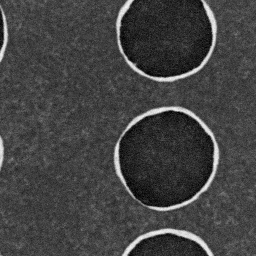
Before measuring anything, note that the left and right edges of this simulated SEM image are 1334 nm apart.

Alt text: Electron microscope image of holes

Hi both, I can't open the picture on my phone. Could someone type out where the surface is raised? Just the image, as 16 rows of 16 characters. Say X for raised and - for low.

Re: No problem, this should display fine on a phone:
XXXXXXXX-----XXX
XXXXXXX------XXX
XXXXXXX------XXX
XXXXXXXX-----XXX
XXXXXXXXX---XXXX
XXXXXXXXXXXXXXXX
XXXXXXXXXXXXXXXX
XXXXXXXXX---XXXX
XXXXXXXX-----XXX
XXXXXXX------XXX
XXXXXXX------XXX
XXXXXXXX-----XXX
XXXXXXXXX---XXXX
XXXXXXXXXXXXXXXX
XXXXXXXXXX-XXXXX
XXXXXXXX-----XXX